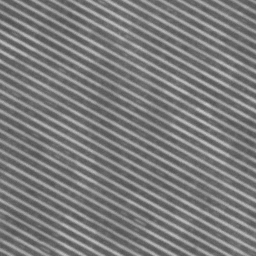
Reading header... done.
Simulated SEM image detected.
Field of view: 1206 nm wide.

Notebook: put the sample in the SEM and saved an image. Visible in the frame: parallel lines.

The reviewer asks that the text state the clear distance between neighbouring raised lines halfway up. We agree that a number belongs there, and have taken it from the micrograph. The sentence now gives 32.1 nm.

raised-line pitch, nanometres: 41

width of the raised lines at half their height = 11.9 nm